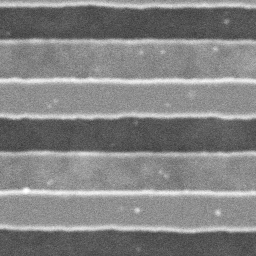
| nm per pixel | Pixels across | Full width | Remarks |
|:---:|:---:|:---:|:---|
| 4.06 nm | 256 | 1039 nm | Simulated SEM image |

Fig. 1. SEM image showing lines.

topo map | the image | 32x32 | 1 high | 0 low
11111111111111111111111111111111
00000000000000000000000000000000
00000000000000000000000000000000
00000000000000000000000000000000
00000000000000000000000000000000
11111111111111111111111111111111
11111111111111111111111111111111
11111111111111111111111111111111
11111111111111111111111111111111
11111111111111111111111111111111
11111111111111111111111111111111
11111111111111111111111111111111
11111111111111111111111111111111
11111111111111111111111111111111
11111111111111100111111111011111
00000000000000000000000000000000
00000000000000000000000000000000
00000000000000000000000000000000
00000000000000000000000000000000
11111111111111111111111111111111
11111111111111111111111111111111
11111111111111111111111111111111
11111111111111111111111111111111
11111111111111111111111111111111
11111111111111111111111111111111
11111111111111111111111111111111
11111111111111111111111111111111
11111111111111111111111111111111
01111111111111111111111111111111
00000000000000000000000000000000
00000000000000000000000000000000
00000000000000000000000000000000